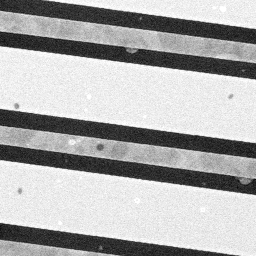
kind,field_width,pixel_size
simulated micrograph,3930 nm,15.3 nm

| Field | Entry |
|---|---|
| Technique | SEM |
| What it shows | lines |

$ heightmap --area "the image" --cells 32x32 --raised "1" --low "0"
00000000001111111111111111111111
10000000000000000111111111111111
11111111000000000000000011111111
11111111111111110000000000000001
00000111111111111111111100000000
00000000000001111111111111111110
11111000000000000000011111111111
11111111111110000000000000000111
11111111111111111111100000000000
11111111111111111111111111110000
11111111111111111111111111111111
11111111111111111111111111111111
11111111111111111111111111111111
11111111111111111111111111111111
00000001111111111111111111111111
00000000000000111111111111111111
11111100000000000000001111111111
11111111111111000000000000000111
00011111111111111111100000000000
00000000000111111111111111111000
11100000000000000011111111111111
11111111110000000000000000111111
11111111111111111100000000000000
11111111111111111111111110000000
11111111111111111111111111111111
11111111111111111111111111111111
11111111111111111111111111111111
11111111111111111111111111111111
00000111111111111111111111111111
00000000000001111111111111111111
11110000000000000000111111111111
11111111111000000000000000011111